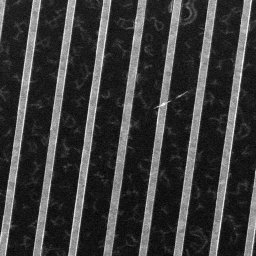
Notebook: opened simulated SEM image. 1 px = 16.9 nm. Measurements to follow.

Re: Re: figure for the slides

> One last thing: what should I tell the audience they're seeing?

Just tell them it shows parallel lines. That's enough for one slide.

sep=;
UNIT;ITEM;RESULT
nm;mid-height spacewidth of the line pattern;472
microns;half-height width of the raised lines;0.117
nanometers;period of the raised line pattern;587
